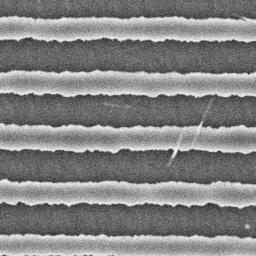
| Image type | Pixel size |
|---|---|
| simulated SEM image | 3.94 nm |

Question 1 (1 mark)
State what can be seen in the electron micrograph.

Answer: lines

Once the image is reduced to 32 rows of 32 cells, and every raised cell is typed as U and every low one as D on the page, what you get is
DDDDDDDDDDDDDDDDDDDDDDDDDDDDDDDD
DDDDDDDDDDDDDDDDDDDDDDDDDDDDDDDD
UUUUDDDUUUUUUUUUUUUUUUUUDDUUUDUD
UUUUUUUUUUUUUUUUUUUUUUUUUUUUUUUU
UUUUUUUUUUUUUUUUUUUUUUUUUUUUUUUU
DDDDDDDDDDDDDDDDDDDDDDDDDDDDDDDD
DDDDDDDDDDDDDDDDDDDDDDDDDDDDDDDD
DDDDDDDDDDDDDDDDDDDDDDDDDDDDDDDD
DDDDDDDDDDDDDDDDDDDDDDDDDDDDDDDD
UUUUUUUUUUUUUUUUUUUUUUUUUUUUUUUU
UUUUUUUUUUUUUUUUUUUUUUUUUUUUUUUU
UUUUUUUUUUUUUUUUUUUUUUUUUUUUUUUU
DDDDDDDDDDDDDDDDDDDDDDDDDDDDDDDD
DDDDDDDDDDDDDDDDDDDDDDDDDDDDDDDD
DDDDDDDDDDDDDDDDDDDDDDDDDDDDDDDD
DDDDDDDDDDDDDDDDDDDDDDDDDDDDDDDD
UUUUUUUUUUUUUUUUUUUUUUUUUUUUUUUU
UUUUUUUUUUUUUUUUUUUUUUUUUUUUUUUU
UUUUUUUUUUUUUUUUUUUUUUUUUUUUUUUU
DDDDDDDDDDDDDDDDDDDDDDDDDDDDDDDD
DDDDDDDDDDDDDDDDDDDDDDDDDDDDDDDD
DDDDDDDDDDDDDDDDDDDDDDDDDDDDDDDD
DDDDDDDDDDDDDDDDDDDDDDDDDDDDDDDD
UUUUUUUUUUUUUUUUUUUUUUUUUUUUUUUU
UUUUUUUUUUUUUUUUUUUUUUUUUUUUUUUU
DUDUUDUDUDDDDUDUUUDUUUUUUUDUUUUU
DDDDDDDDDDDDDDDDDDDDDDDDDDDDDDDD
DDDDDDDDDDDDDDDDDDDDDDDDDDDDDDDD
DDDDDDDDDDDDDDDDDDDDDDDDDDDDDDDD
UUUUUDDUDDUDUDDDDDDDDDDDDDDDDDDD
UUUUUUUUUUUUUUUUUUUUUUUUUUUUUUUU
UUUUUUUUUUUUUUUUUUUUUUUUUUUUUUUU